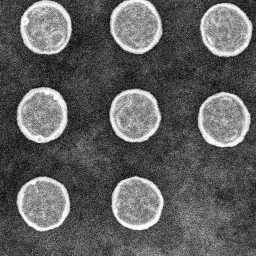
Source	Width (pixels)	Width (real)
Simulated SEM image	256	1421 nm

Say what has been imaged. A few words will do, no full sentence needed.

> raised bodies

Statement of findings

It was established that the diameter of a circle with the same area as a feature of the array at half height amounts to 0.28 microns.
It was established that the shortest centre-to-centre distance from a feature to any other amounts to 488 nanometers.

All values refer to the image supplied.